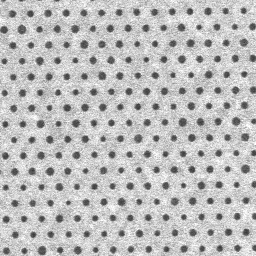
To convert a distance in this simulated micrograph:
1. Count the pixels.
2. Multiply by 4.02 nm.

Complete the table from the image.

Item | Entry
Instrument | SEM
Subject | a regular array of holes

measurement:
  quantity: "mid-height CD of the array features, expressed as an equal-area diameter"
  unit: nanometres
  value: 29.4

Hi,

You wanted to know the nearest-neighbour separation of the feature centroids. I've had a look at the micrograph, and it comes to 70.9 nm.